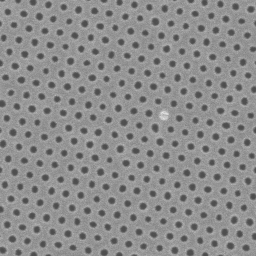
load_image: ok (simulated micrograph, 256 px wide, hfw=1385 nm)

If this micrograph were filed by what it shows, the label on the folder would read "a regular array of holes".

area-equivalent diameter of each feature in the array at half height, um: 0.0377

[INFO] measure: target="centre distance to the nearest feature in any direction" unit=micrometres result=0.0791